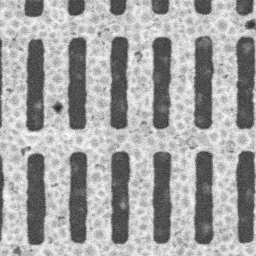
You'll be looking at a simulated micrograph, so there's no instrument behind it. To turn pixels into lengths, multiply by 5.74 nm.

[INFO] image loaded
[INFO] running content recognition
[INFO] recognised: a regular array of holes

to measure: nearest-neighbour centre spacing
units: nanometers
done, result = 240